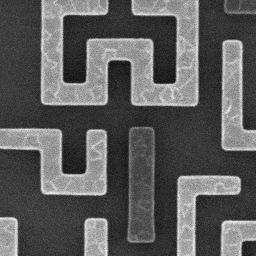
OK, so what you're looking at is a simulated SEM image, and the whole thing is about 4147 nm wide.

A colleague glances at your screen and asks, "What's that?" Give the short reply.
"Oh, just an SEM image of wiring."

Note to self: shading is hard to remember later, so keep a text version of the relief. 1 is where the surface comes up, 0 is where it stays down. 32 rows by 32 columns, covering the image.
00000111111110000111111110001111
00000111111110000111111110001111
00000111000000000000001110000000
00000111000000000000001110000000
00000111000000000000001110000000
00000111000111111110001110001100
00000111000111111110001110001100
00000111000111001110001110001100
00000111000110001110001110001100
00000111000110001110001110001100
00000111101110001111001110001100
00000111111110001111111110001100
00000111111110001111111110001100
00000000000000000000000000001100
00000000000000000000000000001100
00000000000000000000000000001100
11111111000110001110000000001111
11111111000110001110000000001111
11111111000110001110000000001111
00000111000110001110000000000000
00000111000110001110000000000000
00000111000110001110000000000000
00000111111110001110001111111100
00000111111110001110001111111100
00000000000000001110001110000000
00000000000000001110001100000000
00000000000000001110001100000000
11000000000110001110001100000000
11000000000110001110001100001111
11000000000110001110001100001111
11000000000110000000001100001100
11000000000110000000001100001100